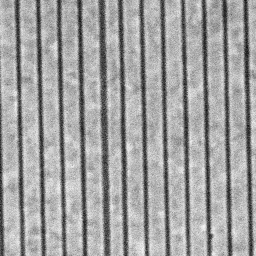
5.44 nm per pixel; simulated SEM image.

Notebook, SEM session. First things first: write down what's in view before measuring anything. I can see parallel lines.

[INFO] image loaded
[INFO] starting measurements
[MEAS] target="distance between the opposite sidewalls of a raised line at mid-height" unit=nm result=78.9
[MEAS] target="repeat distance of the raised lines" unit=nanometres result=113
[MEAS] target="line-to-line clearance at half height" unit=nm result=32.6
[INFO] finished